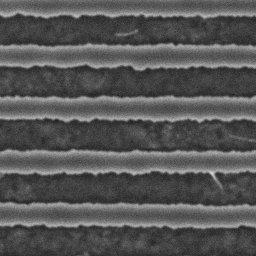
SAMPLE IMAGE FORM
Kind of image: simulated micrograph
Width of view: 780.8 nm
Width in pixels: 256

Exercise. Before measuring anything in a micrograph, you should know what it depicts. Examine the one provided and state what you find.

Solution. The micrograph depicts lines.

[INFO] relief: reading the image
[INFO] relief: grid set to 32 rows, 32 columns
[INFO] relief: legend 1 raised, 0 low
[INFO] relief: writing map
11111111111111111111111111111111
11111111111111111111111111111111
00000000000000000000000000000000
00000000000000000000000000000000
00000000000000000000000000000000
00000000000000000000000000000000
11111111111111111111111111111111
11111111111111111111111111111111
00000000000010000111001000000001
00000000000000000000000000000000
00000000000000000000000000000000
00000000000000000000000000000000
11111111111111111111111111111111
11111111111111111111111111111111
11111111111111111111111111111111
00000000000000000000000000000000
00000000000000000000000000000000
00000000000000000000000000000000
00000000000000000000000000000000
11111111111111111111111111111111
11111111111111111111111111111111
11111111111110111110011011101100
00000000000000000000000000000000
00000000000000000000000000000000
00000000000000000000000000000000
11001111101100010000000000000000
11111111111111111111111111111111
11111111111111111111111111111111
00000000000000000000000001000000
00000000000000000000000000000000
00000000000000000000000000000000
00000000000000000000000000000000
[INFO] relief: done